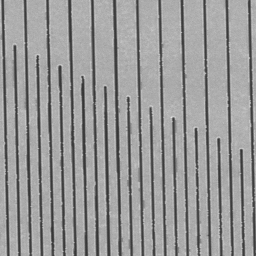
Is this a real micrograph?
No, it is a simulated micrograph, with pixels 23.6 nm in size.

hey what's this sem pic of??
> parallel lines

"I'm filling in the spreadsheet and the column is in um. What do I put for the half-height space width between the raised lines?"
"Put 0.0797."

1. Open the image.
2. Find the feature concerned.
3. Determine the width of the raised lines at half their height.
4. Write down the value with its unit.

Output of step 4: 0.204 microns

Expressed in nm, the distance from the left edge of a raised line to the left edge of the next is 265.